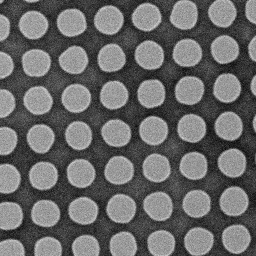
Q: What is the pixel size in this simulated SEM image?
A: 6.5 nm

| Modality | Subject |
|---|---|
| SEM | an array of small figures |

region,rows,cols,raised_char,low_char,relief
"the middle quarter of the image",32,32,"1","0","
11111000011111100001111100000000
11111000001110000000000000000000
00000000000000000000000000000000
00000000000000000000000000000011
00000000000011000000111100000111
01111000001111100001111110001111
11111100001111110001111110001111
11111100011111110001111110001111
11111110011111110001111110001111
11111100001111100001111110000111
11111100001111000000111000000000
01111000000000000000000000000000
00000000000000000000000000000000
00000000000000000000011100000011
00000000000111100000111110000111
01111100001111110001111111000111
01111110011111110001111111000111
01111110001111111001111111000111
01111110001111110001111110000111
01111110000111110000011100000000
00111100000001000000000000000000
00000000000000000000000000000000
00000000000000000000000000000001
00000000000011100000011110000011
00111100000111111000111111000111
01111110000111111000111111000111
01111110001111111000111111000111
01111111001111111000111111000011
01111110000111111000011111000001
00111110000011110000000000000000
00011100000000000000000000000000
00000000000000000000000000000000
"